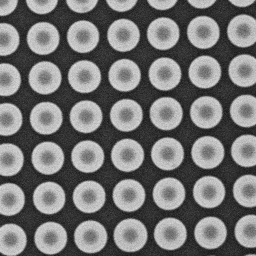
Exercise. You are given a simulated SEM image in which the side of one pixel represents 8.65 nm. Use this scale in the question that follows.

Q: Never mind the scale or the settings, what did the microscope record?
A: an array of small figures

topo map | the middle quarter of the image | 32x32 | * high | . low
..******....******....*******...
.********..********..********..*
.********..********..********..*
.********..********..********..*
.********..********...*******...
..******....******.....*****....
...****.......***...............
................................
........................***.....
....***......*****.....*****....
..*******...*******...*******...
..*******...*******...*******...
..*******...*******...*******...
..*******...*******...*******...
..*******...*******...*******...
..*******....*****.....*****....
...*****......***...............
................................
..........................*.....
....***.......****.....******...
...******....******...*******...
..*******...********..********..
..********..********..********..
..********..********..********..
..********..********..*******...
...******....******....******...
....****......***...............
................................
................................
.....***......****......*****...
...******....******....*******..
...*******..********..********..